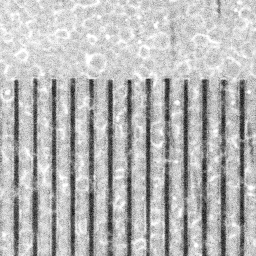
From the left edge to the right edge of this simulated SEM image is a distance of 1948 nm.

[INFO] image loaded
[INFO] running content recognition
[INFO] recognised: parallel lines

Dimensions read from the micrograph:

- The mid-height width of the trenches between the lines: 0.0941 microns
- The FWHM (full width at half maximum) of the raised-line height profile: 49.4 nanometres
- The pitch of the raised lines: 140 nanometres